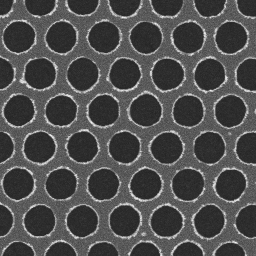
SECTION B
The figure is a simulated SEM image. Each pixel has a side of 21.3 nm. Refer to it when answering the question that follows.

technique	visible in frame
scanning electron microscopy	a regular array of holes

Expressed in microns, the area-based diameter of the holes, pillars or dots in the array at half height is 0.668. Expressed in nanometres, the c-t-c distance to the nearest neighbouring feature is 897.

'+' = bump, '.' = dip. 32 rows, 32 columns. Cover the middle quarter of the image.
+.......++++.......++++......+++
+.......++++.......+++........++
+........++........+++........++
+.......+++........+++........++
+.......++++......++++.......+++
++.....+++++......+++++.....++++
++++.+++++++++..++++++++..++++++
++++++++++++++++++++..++++++++++
..++++++....++++++.....++++++...
...++++......++++.......++++....
...+++........+++.......+++.....
...+++........++.........++.....
...+++........++........+++.....
...++++.......+++.......+++.....
..+++++......++++......+++++....
+++++++++++++++++++...++++++++..
++++++++++++++++++++++++++++++++
++.....++++++....+++++++....++++
+.......++++......+++++......+++
+.......++++.......+++.......+++
+.......+++........+++........++
+........++........+++........++
+.......++++.......+++.......+++
++.....+++++......+++++......+++
++++.+++++++++...+++++++....++++
++++++++++++++++++++++++++++++++
.+++++++....+++++++...++++++++..
...++++......+++++......++++....
...+++........+++.......+++.....
...+++........+++.......+++.....
...+++........++........+++.....
...+++........+++.......+++.....